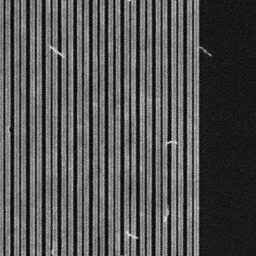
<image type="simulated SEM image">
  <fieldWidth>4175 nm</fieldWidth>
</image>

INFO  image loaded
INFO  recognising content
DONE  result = parallel lines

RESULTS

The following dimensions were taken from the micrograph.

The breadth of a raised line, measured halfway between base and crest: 55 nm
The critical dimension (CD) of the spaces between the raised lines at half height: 4.13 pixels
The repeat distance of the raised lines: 7.87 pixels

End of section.